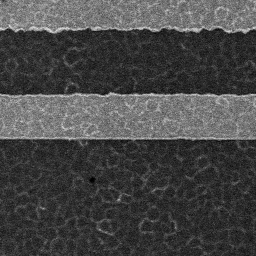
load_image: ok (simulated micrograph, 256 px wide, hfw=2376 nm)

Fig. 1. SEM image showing one or a few lines or trenches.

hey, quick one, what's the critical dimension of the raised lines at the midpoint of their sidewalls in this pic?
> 393 nm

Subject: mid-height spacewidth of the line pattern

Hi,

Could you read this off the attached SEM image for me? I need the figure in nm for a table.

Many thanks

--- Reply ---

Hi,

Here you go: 615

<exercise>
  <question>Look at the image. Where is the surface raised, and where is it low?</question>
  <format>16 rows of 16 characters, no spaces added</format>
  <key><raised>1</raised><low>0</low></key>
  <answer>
1111111111111111
1111111111111111
0000000000000000
0000000000000000
0000000000000000
0000000000000000
1111111111111111
1111111111111111
1111111111111111
0000000000000000
0000000000000000
0000000000000000
0000000000000000
0000000000000000
0000000000000000
0000000000000000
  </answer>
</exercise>